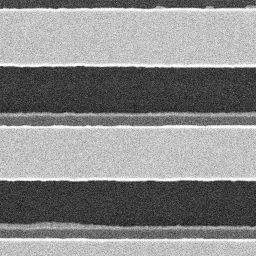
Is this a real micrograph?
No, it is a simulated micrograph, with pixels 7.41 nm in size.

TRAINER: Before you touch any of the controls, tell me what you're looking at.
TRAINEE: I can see lines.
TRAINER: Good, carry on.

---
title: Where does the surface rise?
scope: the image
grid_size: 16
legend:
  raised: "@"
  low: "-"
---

@@@@@@@@@@@@@@@@
@@@@@@@@@@@@@@@@
@@@@@@@@@@@@@@@@
@@@@@@@@@@@@@@@@
----------------
----------------
----------------
@@@@@@@@@@@@@@@@
@@@@@@@@@@@@@@@@
@@@@@@@@@@@@@@@@
@@@@@@@@@@@@@@@@
----------------
----------------
----------------
@@@@@@@@@@@@@@@@
@@@@@@@@@@@@@@@@